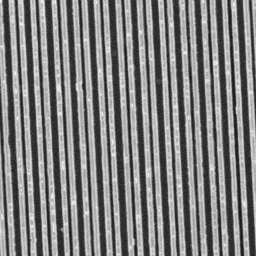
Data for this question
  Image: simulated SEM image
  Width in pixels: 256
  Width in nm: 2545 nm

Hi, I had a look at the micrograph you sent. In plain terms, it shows parallel lines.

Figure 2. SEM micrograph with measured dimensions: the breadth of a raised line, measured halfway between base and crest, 0.0446 micrometres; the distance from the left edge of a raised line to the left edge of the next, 106 nanometres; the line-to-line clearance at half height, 70.7 nm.